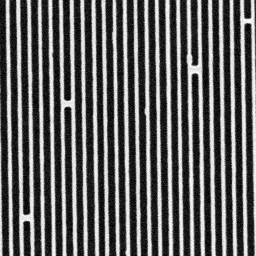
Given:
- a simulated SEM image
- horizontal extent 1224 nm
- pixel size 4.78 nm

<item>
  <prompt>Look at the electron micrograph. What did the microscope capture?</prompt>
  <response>parallel lines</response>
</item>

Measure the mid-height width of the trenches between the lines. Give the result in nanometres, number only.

37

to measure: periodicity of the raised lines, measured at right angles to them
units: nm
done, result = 50.9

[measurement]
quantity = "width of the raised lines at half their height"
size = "0.0167 µm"